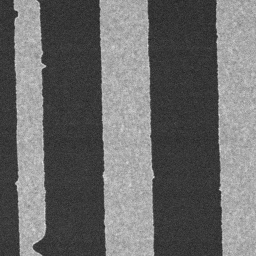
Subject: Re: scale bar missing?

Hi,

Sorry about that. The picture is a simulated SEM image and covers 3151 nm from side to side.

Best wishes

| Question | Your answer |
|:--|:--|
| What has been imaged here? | one or a few lines or trenches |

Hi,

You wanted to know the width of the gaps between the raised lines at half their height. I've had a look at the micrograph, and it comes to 68 pixels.